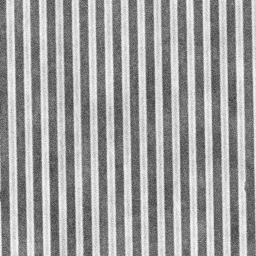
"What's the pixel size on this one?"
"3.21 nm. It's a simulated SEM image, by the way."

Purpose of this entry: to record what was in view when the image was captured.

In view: parallel lines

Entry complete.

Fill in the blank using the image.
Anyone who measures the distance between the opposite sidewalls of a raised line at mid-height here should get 20.9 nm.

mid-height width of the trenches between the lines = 29.7 nm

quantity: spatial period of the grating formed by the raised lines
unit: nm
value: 52.5